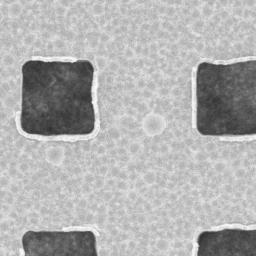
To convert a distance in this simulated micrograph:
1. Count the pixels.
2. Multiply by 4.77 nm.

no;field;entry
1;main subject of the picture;holes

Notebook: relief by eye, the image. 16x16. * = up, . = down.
****************
****************
****************
****************
*.....******....
*.....******....
*.....******....
*.....******....
****************
****************
****************
****************
****************
****************
**...********...
*.....******....